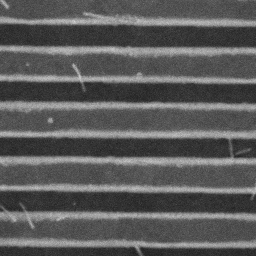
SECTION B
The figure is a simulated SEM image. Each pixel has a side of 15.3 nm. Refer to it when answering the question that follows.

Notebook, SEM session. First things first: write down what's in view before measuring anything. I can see lines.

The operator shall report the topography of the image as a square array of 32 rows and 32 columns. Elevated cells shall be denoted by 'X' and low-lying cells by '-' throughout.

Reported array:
XXXXXXXXXXXXXXXXXXXXXXXXXXXXXXXX
XXXXXXXXXXXXXXXXXXXXXXXXXXXXXXXX
XXXXXXXXXXXXXXXXXXXXXXXXXXXXXXXX
--------------------------------
--------------------------------
--------------------------------
XXXXXXXXXXXXXXXXXXXXXXXXXXXXXXXX
XXXXXXXXXXXXXXXXXXXXXXXXXXXXXXXX
XXXXXXXXXXXXXXXXXXXXXXXXXXXXXXXX
XXXXXXXXXXXXXXXXXXXXXXXXXXXXXXXX
--------------------------------
--------------------------------
--------------------------------
XXXXXXXXXXXXXXXXXXXXXXXXXXXXXXXX
XXXXXXXXXXXXXXXXXXXXXXXXXXXXXXXX
XXXXXXXXXXXXXXXXXXXXXXXXXXXXXXXX
XXXXXXXXXXXXXXXXXXXXXXXXXXXXXXXX
--------------------------------
--------------------------------
--------------------------------
XXXXXXXXXXXXXXXXXXXXXXXXXXXXXXXX
XXXXXXXXXXXXXXXXXXXXXXXXXXXXXXXX
XXXXXXXXXXXXXXXXXXXXXXXXXXXXXXXX
XXXXXXXXXXXXXXXXXXXXXXXXXXXXXXXX
--------------------------------
--------------------------------
--------------------------------
XXXXXXXXXXXXXXXXXXXXXXXXXXXXXXXX
XXXXXXXXXXXXXXXXXXXXXXXXXXXXXXXX
XXXXXXXXXXXXXXXXXXXXXXXXXXXXXXXX
XXXXXXXXXXXXXXXXXXXXXXXXXXXXXXXX
--------------------------------